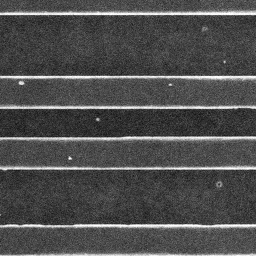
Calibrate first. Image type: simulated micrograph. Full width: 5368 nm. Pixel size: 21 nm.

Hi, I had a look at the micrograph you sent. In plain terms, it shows lines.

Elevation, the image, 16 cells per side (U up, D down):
UUUUUUUUUUUUUUUU
DDDDDDDDDDDDDDDD
DDDDDDDDDDDDDDDD
DDDDDDDDDDDDDDDD
DDDDDDDDDDDDDDDD
UUUUUUUUUUUUUUUU
UUUUUUUUUUUUUUUU
DDDDDDDDDDDDDDDD
DDDDDDDDDDDDDDDD
UUUUUUUUUUUUUUUU
UUUUUUUUUUUUUUUU
DDDDDDDDDDDDDDDD
DDDDDDDDDDDDDDDD
DDDDDDDDDDDDDDDD
UUUUUUUUUUUUUUUU
UUUUUUUUUUUUUUUU